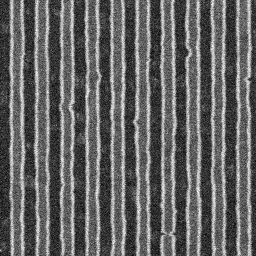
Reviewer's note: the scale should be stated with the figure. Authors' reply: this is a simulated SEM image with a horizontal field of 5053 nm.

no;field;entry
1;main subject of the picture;parallel lines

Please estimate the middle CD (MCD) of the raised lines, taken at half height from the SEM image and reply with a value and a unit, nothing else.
11.7 pixels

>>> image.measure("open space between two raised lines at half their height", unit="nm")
269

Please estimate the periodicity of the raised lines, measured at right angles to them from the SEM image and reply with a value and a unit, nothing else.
497 nm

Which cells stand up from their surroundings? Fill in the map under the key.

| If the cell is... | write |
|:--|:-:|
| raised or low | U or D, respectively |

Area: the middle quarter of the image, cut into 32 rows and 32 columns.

UUDDDDUUDDDDUUUDDDUUUDDDUUUDDDDU
UUDDDDUUUDDDUUUDDDUUUDDDUUUUDDDU
UUDDDDUUUDDDUUUDDDUUUDDDUUUUDDDU
UUDDDDUUUDDDUUUDDDUUUDDDUUUDDDDU
UUDDDDUUUDDDUUUDDDUUUDDDDUUUDDDU
UUDDDDUUDDDDUUUDDDUUUDDDDUUUDDDU
UUDDDDUUDDDDUUUDDDUUUDDDDUUUDDDU
UUDDDDUUDDDDUUUDDDUUUDDDDUUUDDDU
UUDDDDUUDDDDUUUDDDUUUDDDDUUDDDDU
UUDDDDUUDDDDUUUDDDUUUDDDDUUDDDDU
UUDDDDUUDDDDUUUDDDUUUDDDDUUDDDDU
UUDDDDUUDDDDUUUDDDUUUDDDDUUDDDDU
UUDDDDUUUDDDUUUDDDUUUDDDDUUUDDDU
UUDDDDUUUDDDUUUDDDUUUDDDDUUUDDDU
UUDDDDUUUDDDUUUDDDUUUDDDDUUUDDDU
UUDDDDUUUDDDUUUDDDUUUDDDDUUUDDDU
UUDDDDUUUDDDUUUDDDUUUDDDDUUUDDDU
UUDDDDUUUDDDUUUDDDUUUDDDDUUDDDDU
UUDDDDUUUDDDUUUDDDUUUDDDDUUDDDDU
UUDDDDUUUDDDUUUDDDUUUDDDDUUDDDDU
UUDDDDUUUDDDUUUDDDUUUDDDDUUUDDDU
UUDDDDUUUDDDUUUDDDUUUDDDDUUUDDDU
UUDDDDUUUDDDUUUDDDUUUDDDDUUDDDDU
UUDDDDUUUDDDUUUDDDUUUDDDDUUDDDDU
UUDDDDUUUDDDUUUDDDUUUDDDDUUDDDDU
UUDDDDUUDDDDUUUDDDUUUDDDDUUDDDDU
UUDDDDUUDDDDUUUDDDUUUDDDDUUDDDDU
UUDDDDUUUDDDUUUDDDUUUDDDDUUDDDDU
UUDDDDUUUDDDUUUDDDDUUDDDDUUDDDDU
UUDDDDUUDDDDUUUDDDDUUDDDDUUDDDDU
UUDDDDUUUDDDUUUDDDDUUDDDDUUDDDDU
UUDDDDUUDDDDUUUDDDUUUDDDDUUDDDDU